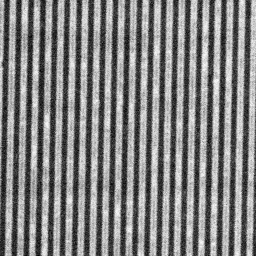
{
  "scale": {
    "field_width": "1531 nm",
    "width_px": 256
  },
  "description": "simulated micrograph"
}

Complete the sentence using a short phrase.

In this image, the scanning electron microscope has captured parallel lines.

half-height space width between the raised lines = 44.8 nm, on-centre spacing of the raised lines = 72.1 nm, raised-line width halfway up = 27.6 nm